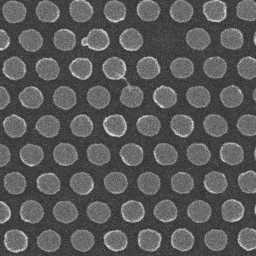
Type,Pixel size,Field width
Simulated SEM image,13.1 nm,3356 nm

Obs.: a regular array of raised bodies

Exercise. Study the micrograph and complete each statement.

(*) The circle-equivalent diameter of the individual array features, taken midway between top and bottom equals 295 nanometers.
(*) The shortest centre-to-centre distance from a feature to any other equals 0.431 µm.